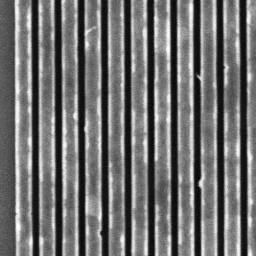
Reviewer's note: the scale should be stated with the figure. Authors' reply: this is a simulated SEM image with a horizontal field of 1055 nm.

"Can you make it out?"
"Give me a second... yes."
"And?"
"parallel lines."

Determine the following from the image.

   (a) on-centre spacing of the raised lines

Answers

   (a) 0.0954 µm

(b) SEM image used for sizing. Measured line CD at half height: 63.9 nanometers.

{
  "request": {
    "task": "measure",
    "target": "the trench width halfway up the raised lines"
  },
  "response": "32 nanometres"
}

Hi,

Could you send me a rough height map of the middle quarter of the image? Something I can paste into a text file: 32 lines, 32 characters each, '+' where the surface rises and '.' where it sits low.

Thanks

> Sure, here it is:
+++..++++..++++..++++..+++...+++
+++..++++..++++..++++..+++...+++
+++..++++..++++..++++..+++...+++
+++..++++..++++..++++..+++...+++
+++..++++..++++..++++..+++...+++
+++..++++..++++..++++..+++...+++
+++..++++..++++..++++..+++...+++
+++..++++..++++..++++..+++...+++
+++..++++..++++..++++..+++...+++
+++..++++..++++..++++..+++...+++
+++..++++..++++..++++..+++...+++
+++..++++..++++..++++..+++...+++
+++..++++..++++..++++..+++...+++
+++..++++..++++..++++..+++...+++
+++..++++..++++..++++..+++...+++
+++..++++..++++..++++..+++...+++
+++..++++..++++..++++..+++...+++
+++..++++..++++..++++..+++...+++
+++..++++..++++..++++..+++...+++
+++..++++..++++..++++..+++...+++
+++..++++..++++..++++..+++...+++
+++..++++..++++..++++..+++...+++
+++..++++..++++..++++..+++...+++
+++..++++..++++..++++..+++...+++
+++...+++..++++..++++..+++...+++
+++...+++..++++..++++..+++...+++
+++...+++..++++..++++..+++...+++
+++...+++..++++..++++..+++...+++
+++...+++..++++..++++..+++...+++
+++...+++..++++..++++..+++...+++
+++...+++..++++..++++..+++...+++
+++...+++..++++..++++..+++...+++